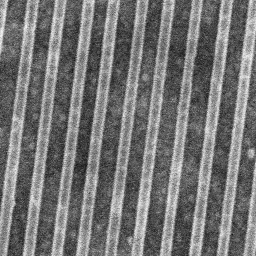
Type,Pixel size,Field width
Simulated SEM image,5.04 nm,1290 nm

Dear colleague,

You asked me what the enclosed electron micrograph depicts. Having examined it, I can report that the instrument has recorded parallel lines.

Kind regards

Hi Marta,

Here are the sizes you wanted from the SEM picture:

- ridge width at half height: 47.5 nm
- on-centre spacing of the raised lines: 138 nanometres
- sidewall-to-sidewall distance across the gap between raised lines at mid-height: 90.7 nm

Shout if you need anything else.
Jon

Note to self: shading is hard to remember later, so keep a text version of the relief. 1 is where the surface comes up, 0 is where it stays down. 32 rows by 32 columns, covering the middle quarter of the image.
00011100011100001110000110000011
00011000011100001110000110000011
00011000011000001110000110000011
00011001011000001110000110000011
00011001011000001100001110000011
00111000011000001100000110000011
00111000011000001100001110000111
00110000111000001100001100000110
00110000111000011100001100010110
00110000111000011100001100000110
00110000110000011000001100000110
00110000110000011100001100000110
00110000110000011000001100000110
01110000110000011000011100001110
01110001110000011000011100001110
01100001110000011000011000001100
01100001110000111000011000001100
01100001100000111000011000001100
01100001100000111000011000001100
01100001100000111000111000001100
01100001100000110000111000001100
11100001100000110000111000001100
11100011100000110000111000001100
11000011100000110000110000011100
11000011100001110000110000011000
11000011100001110000110000011000
11000011000001110000110000011000
11000011000001100000110000011000
11000011000001100000110000011000
11000011000001100001110000011000
10000111000001100001110000110000
10000111000001100001100000110000